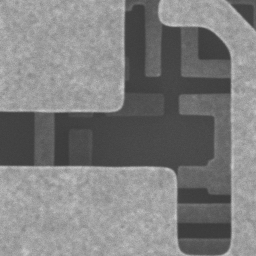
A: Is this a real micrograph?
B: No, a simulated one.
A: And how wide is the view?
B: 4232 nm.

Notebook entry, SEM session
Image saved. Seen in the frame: wiring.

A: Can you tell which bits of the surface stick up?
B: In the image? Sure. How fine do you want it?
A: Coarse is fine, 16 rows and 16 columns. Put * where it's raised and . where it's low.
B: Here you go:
********..*****.
********..******
********......**
********......**
********......**
********......**
********......**
..............**
..............**
..............**
**********....**
***********...**
***********...**
***********...**
***********...**
***********...**